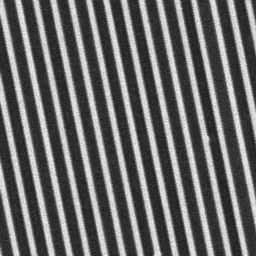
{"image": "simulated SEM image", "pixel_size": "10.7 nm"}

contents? parallel lines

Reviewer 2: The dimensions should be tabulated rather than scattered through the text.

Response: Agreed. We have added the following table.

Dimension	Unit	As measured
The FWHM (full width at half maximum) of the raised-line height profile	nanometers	80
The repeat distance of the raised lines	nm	185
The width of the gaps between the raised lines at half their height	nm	107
